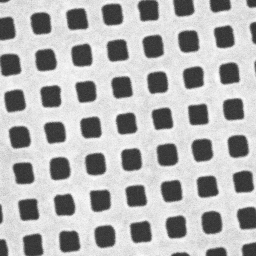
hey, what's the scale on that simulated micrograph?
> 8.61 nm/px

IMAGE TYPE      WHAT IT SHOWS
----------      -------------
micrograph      a regular array of holes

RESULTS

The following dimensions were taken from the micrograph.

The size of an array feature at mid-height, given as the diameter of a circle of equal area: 0.204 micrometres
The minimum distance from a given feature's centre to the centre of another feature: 0.309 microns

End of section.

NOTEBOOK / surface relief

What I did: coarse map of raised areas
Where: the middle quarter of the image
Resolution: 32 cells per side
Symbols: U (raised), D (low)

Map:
UUUDDDDUUUUUUUUUUUUUUUUUUUUUUUUU
UUUUUUUUUUUUUUUUUUUUUUUUUUUUUUDD
UUUUUUUUUUUUUUUUUUUUUDDDDDUUUUDD
UUUUUUUUUUUUDDDDDUUUUDDDDDUUUUDD
UUUDDDDUUUUUDDDDDUUUUDDDDDUUUUDD
UUUDDDDDUUUUDDDDDUUUUDDDDDUUUUDD
UUUDDDDDUUUUDDDDDUUUUDDDDDUUUUUU
UUUDDDDDUUUUDDDDDUUUUUDUUUUUUUUU
UUUDDDDDUUUUUDDDUUUUUUUUUUUUUUUU
UUUUDDDUUUUUUUUUUUUUUUUUUUUUUUUU
UUUUUUUUUUUUUUUUUUUUUUUUUUUUUUUD
UUUUUUUUUUUUUUUUUUUUUUDDDDDUUUUD
UUUUUUUUUUUUUUDDDDUUUUDDDDDUUUUD
UUUUUDDDDUUUUDDDDDUUUUDDDDDUUUUD
UUUUDDDDDUUUUDDDDDUUUUDDDDDUUUUD
UUUUDDDDDUUUUDDDDDUUUUDDDDDUUUUU
DUUUDDDDDDUUUDDDDDUUUUUDUUUUUUUU
DUUUDDDDDDUUUUDDDDUUUUUUUUUUUUUU
DUUUUDDDDUUUUUUUUUUUUUUUUUUUUUUU
UUUUUUUUUUUUUUUUUUUUUUUUUUUUUUUU
UUUUUUUUUUUUUUUUUUUUUUUDDDDDUUUU
UUUUUUUUUUUUUUUDDDDUUUUDDDDDUUUU
UUUUUUDDDDUUUUDDDDDUUUUDDDDDDUUU
DUUUUDDDDDUUUUDDDDDDUUUDDDDDDUUU
DUUUUDDDDDDUUUDDDDDDUUUDDDDDDUUU
DUUUUDDDDDDUUUDDDDDDUUUUDDDUUUUU
DDUUUDDDDDDUUUUDDDDUUUUUUUUUUUUU
DDUUUUDDDDUUUUUUUUUUUUUUUUUUUUUU
DUUUUUUUUUUUUUUUUUUUUUUUUUUUUUUU
UUUUUUUUUUUUUUUUUUUUUUUUUDDDDUUU
UUUUUUUUUUUUUUUUDDDDUUUUDDDDDUUU
UUUUUUUDDDDUUUUDDDDDUUUUDDDDDDUU